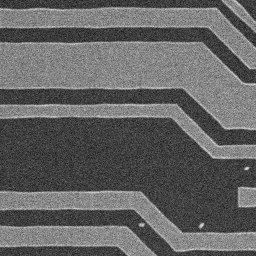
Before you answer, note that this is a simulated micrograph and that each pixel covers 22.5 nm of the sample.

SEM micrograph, groups of lines, slits or small figures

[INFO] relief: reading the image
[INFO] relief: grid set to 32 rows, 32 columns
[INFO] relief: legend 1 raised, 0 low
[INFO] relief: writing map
00000000000000000000000000001100
11111111111111111111111111100110
11111111111111111111111111110011
00000000000000000000000000111001
00000000000000000000000000011100
11111111011111111111111110001110
11111111111111111111111111000111
11111111111111111111111111100011
11111111111111111111111111110000
11111111111111111111111111111000
11111111111111111111111111111110
00000000000000000000000111111111
00000000000000000000000011111111
11111111111111111111110000111111
11111111111111111111111000011111
00000000000000000000001100001111
00000000000000000000000110000000
00000000000000000000000011000000
00000000000000000000000001111111
00000000000000000000000000111111
00000000000000000000000000000000
00000000000000000000000000000000
00000000000000000000000000000000
00000000000000000000000000000010
11111111111111111100000000000011
11111111111111111110000000000011
00000000000000000111000000000000
00000000000000000011100000000000
11111111111111110001110000000000
11111111111111111000111111111111
11111111111111111100011111111111
00000000000000001110000000000000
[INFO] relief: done